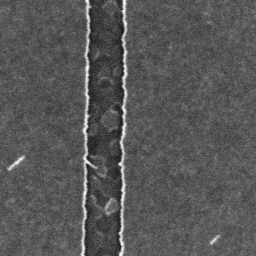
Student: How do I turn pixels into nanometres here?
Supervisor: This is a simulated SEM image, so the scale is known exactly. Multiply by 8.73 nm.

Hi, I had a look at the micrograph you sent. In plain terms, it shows one or a few lines or trenches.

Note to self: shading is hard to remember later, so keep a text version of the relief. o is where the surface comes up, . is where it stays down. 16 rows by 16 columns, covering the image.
oooooo..oooooooo
oooooo..oooooooo
oooooo..oooooooo
ooooo...oooooooo
oooooo..oooooooo
ooooo...oooooooo
ooooo...oooooooo
ooooo..ooooooooo
ooooo...oooooooo
ooooo...oooooooo
ooooo...oooooooo
ooooo...oooooooo
ooooo...oooooooo
ooooo...oooooooo
ooooo...oooooooo
ooooo...oooooooo